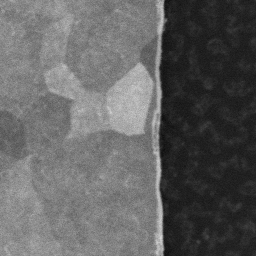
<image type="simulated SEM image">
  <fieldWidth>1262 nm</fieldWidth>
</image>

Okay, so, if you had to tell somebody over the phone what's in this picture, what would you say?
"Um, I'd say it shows one or a few lines or trenches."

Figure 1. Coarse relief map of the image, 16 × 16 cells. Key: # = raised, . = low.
##########......
##########......
##########......
##########......
##########......
##########......
##########......
##########......
##########......
##########......
##########......
##########......
##########......
##########......
##########......
##########......